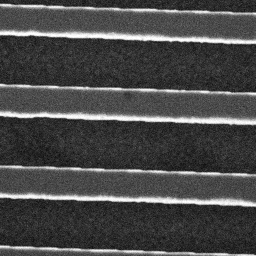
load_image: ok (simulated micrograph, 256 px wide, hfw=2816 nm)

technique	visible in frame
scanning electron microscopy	lines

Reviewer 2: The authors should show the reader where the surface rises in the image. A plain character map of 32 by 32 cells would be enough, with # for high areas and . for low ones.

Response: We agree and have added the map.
................................
###########################.....
################################
################################
......##########################
................................
................................
................................
................................
................................
................................
##########################......
################################
################################
.###############################
...............................#
................................
................................
................................
................................
................................
#####################...........
################################
################################
################################
..............................##
................................
................................
................................
................................
................................
##################..............